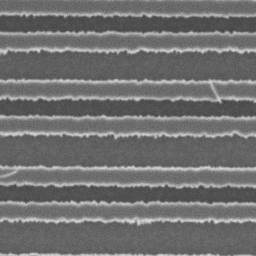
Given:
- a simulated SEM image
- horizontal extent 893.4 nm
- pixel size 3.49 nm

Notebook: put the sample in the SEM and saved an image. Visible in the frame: lines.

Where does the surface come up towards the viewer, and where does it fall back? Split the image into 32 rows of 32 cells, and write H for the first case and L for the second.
HHHHHHHHHHHHHHHHHHHHHHHHHHHHHHHH
HHHHHHHHHHHHHHHHHHHHHHHHHHHHHHHH
LLLLLLLLLLLLLLLLLLLLLLLLLLLLLLLL
LLLLLLLLLLLLLLLLLLLLLLLLLLLLLLLL
HHHHHHHHHHHHHHHHHHHHHHHHHHHHHHHH
HHHHHHHHHHHHHHHHHHHHHHHHHHHHHHHH
HLLLLLLLLLLHLHHLHLLLHLHLLLLHLLHL
LLLLLLLLLLLLLLLLLLLLLLLLLLLLLLLL
LLLLLLLLLLLLLLLLLLLLLLLLLLLLLLLL
LLLLLLLLLLLLLLLLLLLLLLLLLLLLLLLL
HHHHHHHHHHHHHHHHHHHHHHHHHHHHHHHH
HHHHHHHHHHHHHHHHHHHHHHHHHHHHHHHH
LLLLLLLLLLLLLLLLLLLLLLLLHLHHLLLH
LLLLLLLLLLLLLLLLLLLLLLLLLLLLLLLL
HLLLHLLLLLLLLLLLLLLLLLLLLLLLLLLL
HHHHHHHHHHHHHHHHHHHHHHHHHHHHHHHH
HHHHHHHHHHHHHHHHHHHHHHHHHHHHHHHH
LLLLLLLLLLLLLLLLLLLLLLLLLLLLLLLL
LLLLLLLLLLLLLLLLLLLLLLLLLLLLLLLL
LLLLLLLLLLLLLLLLLLLLLLLLLLLLLLLL
LLLLLLLLLLLLLLLLLLLLLLLLLLLLLLLL
HHHHHHHHHHHHHHHHHHHHHHHHHHHHHHHH
HHHHHHHHHHHHHHHHHHHHHHHHHHHHHHHH
LLLLLLLLLLLLLLLLLLLLLLLLLLLLLLLL
LLLLLLLLLLLLLLLLLLLLLLLLLLLLLLLL
HHHHHHHHHHHHHHHHHHHHHHHHHHHHHHHH
HHHHHHHHHHHHHHHHHHHHHHHHHHHHHHHH
HHHHHHHHHHHHHHHHHHHHHHHHHHHHHHHH
LLLLLLLLLLLLLLLLLLLLLLLLLLLLLLLL
LLLLLLLLLLLLLLLLLLLLLLLLLLLLLLLL
LLLLLLLLLLLLLLLLLLLLLLLLLLLLLLLL
LLLLLLLLLLLLLLLLLLLLLLLLLLLLLLLL